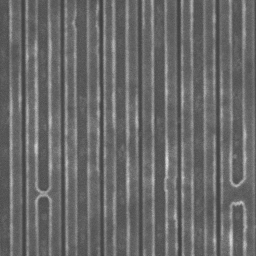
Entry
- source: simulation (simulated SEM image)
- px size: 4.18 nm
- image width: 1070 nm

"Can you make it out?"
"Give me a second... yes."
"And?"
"parallel lines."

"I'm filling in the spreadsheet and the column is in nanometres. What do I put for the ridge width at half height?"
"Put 48.5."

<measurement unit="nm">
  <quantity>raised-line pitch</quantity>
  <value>81.1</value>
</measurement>